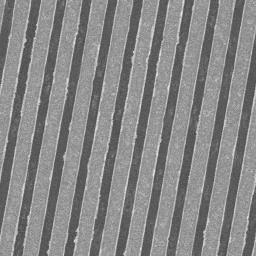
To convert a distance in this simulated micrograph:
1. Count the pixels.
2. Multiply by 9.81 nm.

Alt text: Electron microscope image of parallel lines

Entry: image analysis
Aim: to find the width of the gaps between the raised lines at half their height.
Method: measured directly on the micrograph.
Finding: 9.49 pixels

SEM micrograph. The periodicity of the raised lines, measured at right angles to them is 247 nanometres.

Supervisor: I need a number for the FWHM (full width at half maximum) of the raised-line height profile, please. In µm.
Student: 0.152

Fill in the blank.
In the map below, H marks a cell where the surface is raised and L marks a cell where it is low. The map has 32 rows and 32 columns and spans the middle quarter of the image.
HHLLHHHHLLLHHHLLLHHHHLLHHHHLLLHH
HHLLHHHHLLLHHHLLLHHHHLLHHHHLLLHH
HLLLHHHHLLHHHHLLLHHHLLLHHHHLLHHH
HLLLHHHLLLHHHHLLLHHHLLLHHHHLLHHH
HLLLHHHLLLHHHHLLHHHHLLLHHHLLLHHH
HLLHHHHLLLHHHHLLHHHHLLLHHHLLLHHH
HLLHHHHLLLHHHLLLHHHHLLHHHHLLLHHH
HLLHHHHLLHHHHLLLHHHHLLHHHHLLLHHH
HLLHHHHLLHHHHLLLHHHLLLHHHHLLHHHH
LLLHHHLLLHHHHLLHHHHLLLHHHHLLHHHH
LLLHHHLLLHHHHLLHHHHLLLHHHLLLHHHH
LLHHHHLLLHHHHLLHHHHLLLHHHLLLHHHH
LLHHHHLLLHHHLLLHHHHLLHHHHLLLHHHH
LLHHHHLLHHHHLLLHHHLLLHHHHLLLHHHL
LLHHHHLLHHHHLLHHHHLLLHHHHLLHHHHL
LHHHHLLLHHHHLLHHHHLLLHHHLLLHHHHL
LHHHHLLLHHHHLLHHHHLLLHHHLLLHHHHL
LHHHHLLLHHHHLLHHHHLLLHHHLLLHHHHL
LHHHHLLLHHHLLLHHHHLLHHHHLLLHHHHL
LHHHHLLLHHHLLLHHHHLLHHHHLLLHHHLL
LHHHHLLHHHHLLLHHHLLLHHHHLLHHHHLL
LHHHLLLHHHHLLLHHHLLLHHHLLLHHHHLL
HHHHLLLHHHHLLHHHHLLLHHHLLLHHHHLL
HHHHLLHHHHLLLHHHHLLHHHHLLLHHHHLL
HHHHLLHHHHLLLHHHHLLHHHHLLLHHHLLL
HHHHLLHHHHLLLHHHHLLHHHHLLHHHHLLL
HHHHLLHHHHLLLHHHLLLHHHHLLHHHHLLL
HHHLLLHHHHLLHHHHLLLHHHHLLHHHHLLH
HHHLLLHHHHLLHHHHLLLHHHLLLHHHHLLH
HHHLLLHHHLLLHHHHLLHHHHLLLHHHHLLH
HHHLLHHHHLLLHHHHLLHHHHLLLHHHLLLH
HHHLLHHHHLLLHHHLLLHHHHLLHHHHLLLH